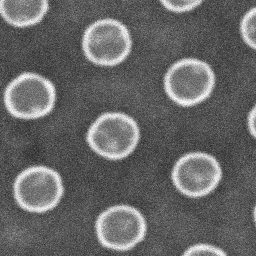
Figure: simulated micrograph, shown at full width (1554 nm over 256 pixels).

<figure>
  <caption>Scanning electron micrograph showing raised bodies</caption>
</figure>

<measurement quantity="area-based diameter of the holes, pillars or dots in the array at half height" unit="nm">269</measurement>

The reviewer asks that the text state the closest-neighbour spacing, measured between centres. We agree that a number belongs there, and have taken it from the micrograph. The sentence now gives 91.2 px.